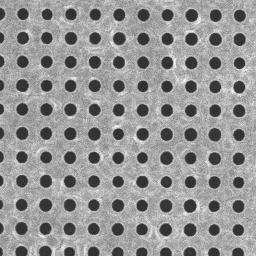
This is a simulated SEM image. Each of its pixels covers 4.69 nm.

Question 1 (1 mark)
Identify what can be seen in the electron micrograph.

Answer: a regular array of holes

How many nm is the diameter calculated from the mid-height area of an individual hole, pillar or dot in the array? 58.5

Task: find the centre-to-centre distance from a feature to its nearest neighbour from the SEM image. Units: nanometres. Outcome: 110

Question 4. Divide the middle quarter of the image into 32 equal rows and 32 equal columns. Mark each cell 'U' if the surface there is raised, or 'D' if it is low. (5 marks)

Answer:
DDDUUUDDDUUUDDDUUUUDDUUUDDDUUUDD
UUUUUUUUUUUUUUUUUUUUUUUUUUUUUUUU
UUUUUUUUUUUUUUUUUUUUUUUUUUUUUUUU
UUUUUUUUUUUUUUUUUUUUUUUUUUUUUUUU
DDDUUUUDDUUUUDDUUUUDDUUUUDDUUUUD
DDDUUUDDDUUUDDDUUUDDDUUUDDDUUUDD
DDDUUUUDDUUUUDDUUUDDDUUUDDDUUUUD
UUUUUUUUUUUUUUUUUUUUUUUUUUUUUUUU
UUUUUUUUUUUUUUUUUUUUUUUUUUUUUUUU
UUUUUUUUUUUUUUUUUUUUUUUUUUUUUUUU
DDDUUUDDDUUUUDDUUUUDDUUUUDDUUUUD
DDDUUUDDDUUUDDDUUUDDDUUUDDDUUUDD
DDDUUUUDDUUUUDDUUUDDDUUUDDDUUUDD
UUUUUUUUUUUUUUUUUUUUUUUUUUUUUUUU
UUUUUUUUUUUUUUUUUUUUUUUUUUUUUUUU
UUUUUUUUUUUUUUUUUUUUUUUUUUUUUUUU
DDDUUUDDDUUUDDDUUUDDDUUUUDDUUUUD
DDDUUUDDDUUUDDDUUUDDDUUUDDDUUUDD
DDDUUUDDDUUUDDDUUUDDDUUUDDDUUUDD
UUUUUUUUUUUUUUUUUUUUUUUUUUUUUUUD
UUUUUUUUUUUUUUUUUUUUUUUUUUUUUUUU
UUUUUUUUUUUUUUUUUUUUUUUUUUUUUUUU
DDDUUUUDDUUUDDDUUUUDDUUUDDDUUUDD
DDDUUUDDDUUUDDDUUUDDDUUUDDDUUUDD
UDDUUUDDDUUUDDDUUUUDDUUUDDDUUUDD
UUUUUUUUUUUUUUUUUUUUUUUUUUUUUUUU
UUUUUUUUUUUUUUUUUUUUUUUUUUUUUUUU
UUUUUUUUUUUUUUUUUUUUUUUUUUUUUUUU
DDDUUUDDDUUUDDDUUUDDDUUUUDUUUUDD
DDDUUUDDDUUUDDDUUUDDDUUUDDDUUUDD
UDDUUUDDUUUUUDDUUUDDDUUUDDDUUUDD
UUUUUUUUUUUUUUUUUUUUUUUUUUUUUUUU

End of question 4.